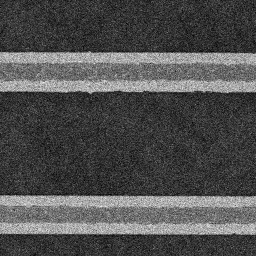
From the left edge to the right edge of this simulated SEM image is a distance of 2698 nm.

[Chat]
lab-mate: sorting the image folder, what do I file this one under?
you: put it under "one or a few lines or trenches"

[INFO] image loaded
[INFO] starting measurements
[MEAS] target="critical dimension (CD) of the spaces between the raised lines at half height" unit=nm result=1210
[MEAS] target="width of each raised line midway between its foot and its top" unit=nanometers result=295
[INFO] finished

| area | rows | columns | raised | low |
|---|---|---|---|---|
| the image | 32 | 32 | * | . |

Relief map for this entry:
................................
................................
................................
................................
................................
................................
................................
********************************
********************************
********************************
********************************
................................
................................
................................
................................
................................
................................
................................
................................
................................
................................
................................
................................
................................
................................
********************************
********************************
********************************
********************************
................................
................................
................................